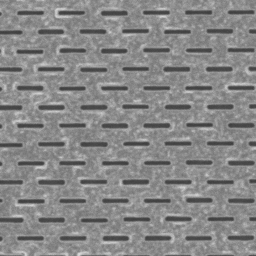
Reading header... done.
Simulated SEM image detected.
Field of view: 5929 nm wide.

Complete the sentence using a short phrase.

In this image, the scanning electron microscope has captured a regular array of holes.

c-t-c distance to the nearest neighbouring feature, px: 27.8